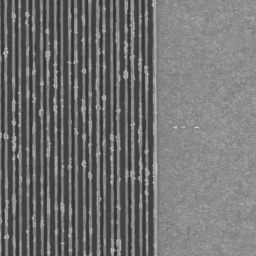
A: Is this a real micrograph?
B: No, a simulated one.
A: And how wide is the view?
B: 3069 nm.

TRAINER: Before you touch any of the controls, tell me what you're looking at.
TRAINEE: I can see parallel lines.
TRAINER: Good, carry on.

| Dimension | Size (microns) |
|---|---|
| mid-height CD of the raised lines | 0.0345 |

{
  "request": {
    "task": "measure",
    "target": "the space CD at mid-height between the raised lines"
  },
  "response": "46.5 nm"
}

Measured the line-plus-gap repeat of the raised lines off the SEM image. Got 84.9 nm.